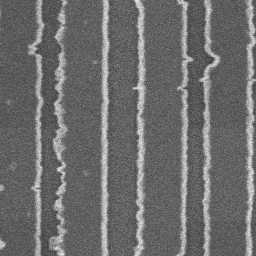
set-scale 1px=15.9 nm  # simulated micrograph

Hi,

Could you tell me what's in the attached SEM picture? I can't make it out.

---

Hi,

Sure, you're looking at one or a few lines or trenches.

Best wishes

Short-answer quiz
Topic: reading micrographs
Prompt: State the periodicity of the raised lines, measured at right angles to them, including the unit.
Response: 1160 nm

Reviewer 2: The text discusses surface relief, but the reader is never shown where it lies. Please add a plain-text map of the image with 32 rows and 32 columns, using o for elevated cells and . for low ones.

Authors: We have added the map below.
ooooo...ooooo....oooooo...ooooo.
ooooo...ooooo.....ooooo...ooooo.
ooooo...ooooo.....ooooo...ooooo.
ooooo...ooooo.....ooooo...ooooo.
ooooo..oooooo.....ooooo...oooooo
oooo...oooooo.....ooooo...ooooo.
oooo....ooooo.....ooooo...ooooo.
ooooo...ooooo.....ooooo....oooo.
ooooo...ooooo.....ooooo...ooooo.
ooooo...ooooo.....ooooo...ooooo.
ooooo...ooooo....oooooo...ooooo.
ooooo...ooooo.....ooooo...ooooo.
ooooo..oooooo.....ooooo...ooooo.
ooooo..oooooo.....ooooo...ooooo.
ooooo..oooooo....oooooo...ooooo.
ooooo...ooooo.....ooooo...ooooo.
ooooo...ooooo....oooooo...ooooo.
ooooo..oooooo.....ooooo...ooooo.
ooooo..oooooo.....ooooo...ooooo.
ooooo..oooooo.....ooooo...ooooo.
ooooo...ooooo.....ooooo...ooooo.
ooooo...ooooo.....ooooo...ooooo.
ooooo...ooooo....oooooo...ooooo.
ooooo...ooooo....oooooo...ooooo.
ooooo..oooooo.....ooooo...ooooo.
ooooo..oooooo....oooooo...ooooo.
ooooo..oooooo.....ooooo...ooooo.
ooooo...ooooo....oooooo...ooooo.
ooooo...ooooo....oooooo...ooooo.
ooooo...ooooo....oooooo...ooooo.
ooooo.ooooooo....oooooo...ooooo.
ooooo...ooooo....oooooo...ooooo.